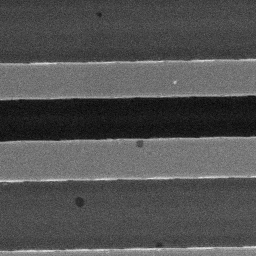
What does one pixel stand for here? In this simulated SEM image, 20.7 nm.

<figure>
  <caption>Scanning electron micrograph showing lines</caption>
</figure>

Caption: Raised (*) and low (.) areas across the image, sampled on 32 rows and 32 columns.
................................
................................
................................
................................
................................
................................
................................
................................
********************************
********************************
********************************
********************************
................................
................................
................................
................................
................................
..............******************
********************************
********************************
********************************
********************************
*******.........................
................................
................................
................................
................................
................................
................................
................................
................................
********************************